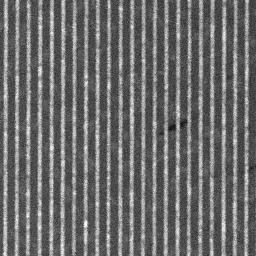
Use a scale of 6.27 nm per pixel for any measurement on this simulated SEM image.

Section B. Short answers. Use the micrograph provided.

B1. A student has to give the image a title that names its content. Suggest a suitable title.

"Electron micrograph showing parallel lines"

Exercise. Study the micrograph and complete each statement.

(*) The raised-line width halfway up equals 0.0173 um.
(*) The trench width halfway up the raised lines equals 55.7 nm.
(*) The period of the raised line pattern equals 72.1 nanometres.